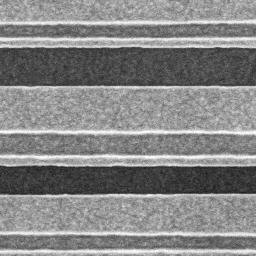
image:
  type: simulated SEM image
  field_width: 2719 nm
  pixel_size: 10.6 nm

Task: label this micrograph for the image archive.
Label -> lines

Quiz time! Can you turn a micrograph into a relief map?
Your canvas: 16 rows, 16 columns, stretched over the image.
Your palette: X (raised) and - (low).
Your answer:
XXXXXXXXXXXXXXXX
XXXXXXXXXXXXXXXX
XXXXXXXXXXXXXXXX
----------------
----------------
XXXXXXXXXXXXXXXX
XXXXXXXXXXXXXXXX
XXXXXXXXXXXXXXXX
XXXXXXXXXXXXXXXX
XXXXXXXXXXXXXXXX
----------------
----------------
XXXXXXXXXXXXXXXX
XXXXXXXXXXXXXXXX
XXXXXXXXXXXXXXXX
XXXXXXXXXXXXXXXX